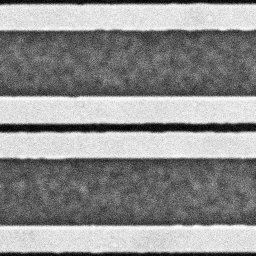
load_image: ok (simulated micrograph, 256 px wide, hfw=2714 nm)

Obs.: lines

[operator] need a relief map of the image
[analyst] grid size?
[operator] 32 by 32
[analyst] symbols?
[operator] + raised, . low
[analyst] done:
................................
++++++++++++++++++++++++++++++++
++++++++++++++++++++++++++++++++
++++++++++++++++++++++++++++++++
................................
................................
................................
................................
................................
................................
................................
................................
++++++++++++++++++++++++++++++++
++++++++++++++++++++++++++++++++
++++++++++++++++++++++++++++++++
................................
................................
++++++++++++++++++++++++++++++++
++++++++++++++++++++++++++++++++
++++++++++++++++++++++++++++++++
................................
................................
................................
................................
................................
................................
................................
................................
++++++++++++++++++++++++++++++++
++++++++++++++++++++++++++++++++
++++++++++++++++++++++++++++++++
..+...++...++....+..............